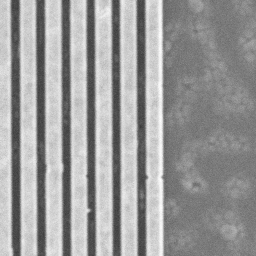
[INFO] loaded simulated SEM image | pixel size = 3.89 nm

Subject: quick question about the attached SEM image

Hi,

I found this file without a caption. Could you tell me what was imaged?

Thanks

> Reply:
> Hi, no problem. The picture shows parallel lines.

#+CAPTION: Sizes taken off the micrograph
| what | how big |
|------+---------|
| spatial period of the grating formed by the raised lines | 97.7 nanometres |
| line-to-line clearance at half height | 44.3 nm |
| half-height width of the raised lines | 54.5 nm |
